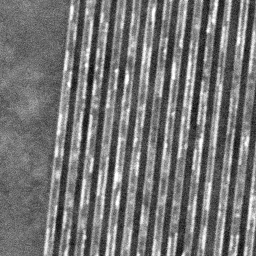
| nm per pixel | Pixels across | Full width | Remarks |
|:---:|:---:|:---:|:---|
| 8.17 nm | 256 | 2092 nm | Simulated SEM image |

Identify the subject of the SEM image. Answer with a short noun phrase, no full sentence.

parallel lines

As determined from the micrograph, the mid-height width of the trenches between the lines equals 61.9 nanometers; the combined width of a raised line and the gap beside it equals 15.3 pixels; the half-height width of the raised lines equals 7.7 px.